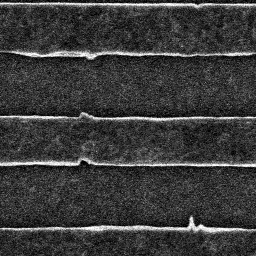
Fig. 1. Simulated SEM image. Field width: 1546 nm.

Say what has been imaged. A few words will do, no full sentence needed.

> one or a few lines or trenches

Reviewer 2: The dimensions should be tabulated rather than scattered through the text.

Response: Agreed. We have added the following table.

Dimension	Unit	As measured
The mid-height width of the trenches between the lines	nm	386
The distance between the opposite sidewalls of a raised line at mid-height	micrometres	0.29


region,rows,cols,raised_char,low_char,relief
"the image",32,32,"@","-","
--@@-@@@@@--@-------------------
@@@@@@@@@@@@@@@@@@@@@@@@@@@@@@@@
@@@@@@@@@@@@@@@@@@@@@@@@@@@@@@@@
@@@@@@@@@@@@@@@@@@@@@@@@@@@@@@@@
@@@@@@@@@@@@@@@@@@@@@@@@@@@@@@@@
@@@@@@@@@@@@@@@@@@@@@@@@@@@@@@@@
@@@@@@@@@@@@@@@@@@@@@@@@@@@@@@@@
--------------------------------
--------------------------------
--------------------------------
--------------------------------
--------------------------------
--------------------------------
--------------------------------
----------@---------------------
@@@@@@@@@@@@@@@@@@@@@@@@@@@@@@@@
@@@@@@@@@@@@@@@@@@@@@@@@@@@@@@@@
@@@@@@@@@@@@@@@@@@@@@@@@@@@@@@@@
@@@@@@@@@@@@@@@@@@@@@@@@@@@@@@@@
@@@@@@@@@@@@@@@@@@@@@@@@@@@@@@@@
@------------@@@@@@@@@@@@@@@@@@@
--------------------------------
--------------------------------
--------------------------------
--------------------------------
--------------------------------
--------------------------------
--------------------------------
------------@@@@@@@-----@-------
@@@@@@@@@@@@@@@@@@@@@@@@@@@@@@@@
@@@@@@@@@@@@@@@@@@@@@@@@@@@@@@@@
@@@@@@@@@@@@@@@@@@@@@@@@@@@@@@@@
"